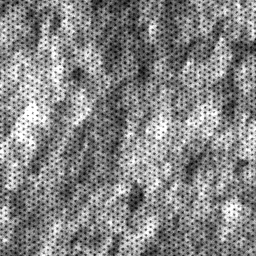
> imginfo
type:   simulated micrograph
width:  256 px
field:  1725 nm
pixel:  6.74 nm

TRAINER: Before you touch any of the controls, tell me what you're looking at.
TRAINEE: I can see a regular array of holes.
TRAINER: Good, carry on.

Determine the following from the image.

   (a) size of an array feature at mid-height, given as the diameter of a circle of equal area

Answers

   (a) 17 nanometres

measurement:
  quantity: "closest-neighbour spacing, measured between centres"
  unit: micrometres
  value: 0.0338